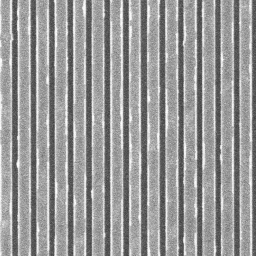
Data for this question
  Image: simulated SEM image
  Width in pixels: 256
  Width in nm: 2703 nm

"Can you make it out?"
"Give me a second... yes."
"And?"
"parallel lines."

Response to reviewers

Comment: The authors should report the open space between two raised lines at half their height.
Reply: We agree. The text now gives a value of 72.6 nm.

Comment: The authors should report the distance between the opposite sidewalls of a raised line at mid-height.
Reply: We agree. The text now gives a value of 127 nanometers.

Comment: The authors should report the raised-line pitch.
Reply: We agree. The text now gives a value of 0.195 microns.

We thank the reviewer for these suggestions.